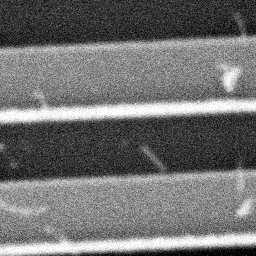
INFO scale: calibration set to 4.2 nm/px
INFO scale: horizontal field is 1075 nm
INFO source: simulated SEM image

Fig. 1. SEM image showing lines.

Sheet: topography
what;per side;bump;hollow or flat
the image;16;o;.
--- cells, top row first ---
................
................
..............oo
oooooooooooooooo
oooooooooooooooo
oooooooooooooooo
oooooooooooooooo
o...............
................
................
................
oooooooooooooooo
oooooooooooooooo
oooooooooooooooo
oooooooooooooooo
oooooooooo......